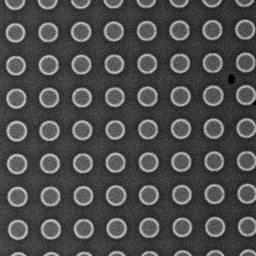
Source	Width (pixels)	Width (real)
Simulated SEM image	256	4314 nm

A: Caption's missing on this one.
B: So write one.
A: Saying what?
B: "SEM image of an array of small figures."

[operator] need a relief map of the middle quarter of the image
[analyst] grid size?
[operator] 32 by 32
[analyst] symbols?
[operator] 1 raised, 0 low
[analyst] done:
00111110001111100001111000011110
00111100000111000001111000001110
00000000000000000000000000000000
00000000000000000000000000000000
00000000000000000000000000000000
00000000000000000000000000000000
00011100000111000001111000001110
00111110000111100001111000011110
00111110000111100001111000011110
00011110000111100001111000011110
00001000000000000000000000000000
00000000000000000000000000000000
00000000000000000000000000000000
00000000000000000000000000000000
00011100000011000000110000001110
00011110000111100001111000011110
00111110000111100001111000011111
00111110000111100001111000011110
00011100000011000000110000000000
00000000000000000000000000000000
00000000000000000000000000000000
00000000000000000000000000000000
00000000000011000000110000001110
00011110000111100001111000011110
00011110000111100001111000011111
00011110000111100001111000011110
00011100000111000000110000001100
00000000000000000000000000000000
00000000000000000000000000000000
00000000000000000000000000000000
00000000000000000000000000000000
00011110000111100001111000011110